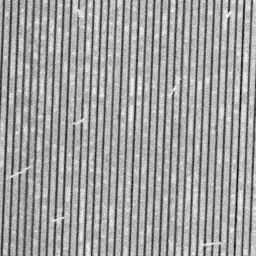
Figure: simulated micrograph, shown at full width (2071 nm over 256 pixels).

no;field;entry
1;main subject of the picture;parallel lines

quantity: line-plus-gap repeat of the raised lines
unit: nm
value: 60.7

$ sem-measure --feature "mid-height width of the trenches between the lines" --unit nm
20.2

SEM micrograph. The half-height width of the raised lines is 0.0414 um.